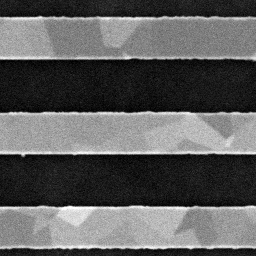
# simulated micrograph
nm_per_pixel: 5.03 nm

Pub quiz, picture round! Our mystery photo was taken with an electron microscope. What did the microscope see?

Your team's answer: lines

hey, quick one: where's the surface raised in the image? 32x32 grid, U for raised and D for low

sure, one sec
DDDDDDDDDDDDDDDDDDDDDDDDDDDDDDDD
DDDDDDDDDDDDDDDDDDDDDDDDDDDDDDDD
UUUUUUUUUUUUUUUUUUUUUUUUUUUUUUUU
UUUUUUUUUUUUUUUUUUUUUUUUUUUUUUUU
UUUUUUUUUUUUUUUUUUUUUUUUUUUUUUUU
UUUUUUUUUUUUUUUUUUUUUUUUUUUUUUUU
UUUUUUUUUUUUUUUUUUUUUUUUUUUUUUUU
DDDDDDDDDDDDDDDDDDDDDDDDDDDDDDDD
DDDDDDDDDDDDDDDDDDDDDDDDDDDDDDDD
DDDDDDDDDDDDDDDDDDDDDDDDDDDDDDDD
DDDDDDDDDDDDDDDDDDDDDDDDDDDDDDDD
DDDDDDDDDDDDDDDDDDDDDDDDDDDDDDDD
DDDDDDDDDDDDDDDDDDDDDDDDDDDDDDDD
DDDDDDDDDDDDDDDDDDDDDDDDDDDDDDDD
UUUUUUUUUUUUUUUUUUUUUUUUUUUUUUUU
UUUUUUUUUUUUUUUUUUUUUUUUUUUUUUUU
UUUUUUUUUUUUUUUUUUUUUUUUUUUUUUUU
UUUUUUUUUUUUUUUUUUUUUUUUUUUUUUUU
UUUUUUUUUUUUUUUUUUUUUUUUUUUUUUUU
DDDDDDDDDDDDDDDDDDDDDDDDDDDDDDDD
DDDDDDDDDDDDDDDDDDDDDDDDDDDDDDDD
DDDDDDDDDDDDDDDDDDDDDDDDDDDDDDDD
DDDDDDDDDDDDDDDDDDDDDDDDDDDDDDDD
DDDDDDDDDDDDDDDDDDDDDDDDDDDDDDDD
DDDDDDDDDDDDDDDDDDDDDDDDDDDDDDDD
DDDDDDDDDDDDDDDDDDDDDDDDDDDDDDDD
UUUUUUUUUUUUUUUUUUUUUUUUUUUUUUUU
UUUUUUUUUUUUUUUUUUUUUUUUUUUUUUUU
UUUUUUUUUUUUUUUUUUUUUUUUUUUUUUUU
UUUUUUUUUUUUUUUUUUUUUUUUUUUUUUUU
UUUUUUUUUUUUUUUUUUUUUUUUUUUUUUUU
DDDDDDDDDDDDDDDDDDDDDDDDDDDDDDDD